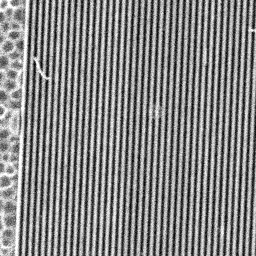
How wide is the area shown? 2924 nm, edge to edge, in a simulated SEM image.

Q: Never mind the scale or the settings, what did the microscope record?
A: parallel lines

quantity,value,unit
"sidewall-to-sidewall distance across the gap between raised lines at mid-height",0.0413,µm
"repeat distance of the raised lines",72.8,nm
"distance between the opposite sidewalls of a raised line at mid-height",31.4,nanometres